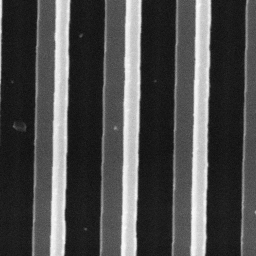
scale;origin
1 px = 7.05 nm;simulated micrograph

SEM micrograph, lines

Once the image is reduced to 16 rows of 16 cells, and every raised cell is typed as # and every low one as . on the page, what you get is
..##...##..##..#
..##...##..##..#
..##...##..##..#
..##...##..##..#
..##...##..##..#
..##..###..##..#
..##..###..##..#
..##..###..##..#
..##..###..##..#
..##..###..##..#
..##..###..##..#
..##..###..##..#
..##..###..##..#
..##..###..##..#
..##..###..##..#
..##..###..##..#